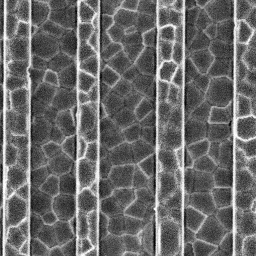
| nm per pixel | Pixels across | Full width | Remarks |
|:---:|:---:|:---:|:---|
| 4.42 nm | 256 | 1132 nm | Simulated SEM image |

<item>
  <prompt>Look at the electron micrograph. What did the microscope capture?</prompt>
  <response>one or a few lines or trenches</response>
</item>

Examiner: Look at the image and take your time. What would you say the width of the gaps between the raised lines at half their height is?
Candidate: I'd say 0.219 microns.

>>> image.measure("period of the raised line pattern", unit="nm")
339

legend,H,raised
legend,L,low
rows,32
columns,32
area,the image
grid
LHHHLLLLLLHHLLLLLLLLHHHLLLLLLHHH
LHHHLLLLLLHHLLLLLLLLHHHLLLLLLHHH
LHHHLLLLLLHHLLLLLLLLHHHLLLLLLHHH
LHHHLLLLLLHHLLLLLLLLHHHLLLLLLHHH
LHHHLLLLLLHHLLLLLLLLHHHLLLLLLHHH
LHHHLLLLLLHHLLLLLLLLHHHLLLLLLHHH
LHHHLLLLLLHHLLLLLLLLHHHLLLLLLHHH
LHHHLLLLLLHHLLLLLLLLHHHLLLLLLHHH
LHHHLLLLLLHHLLLLLLLLHHHLLLLLLHHH
LHHHLLLLLLHHLLLLLLLLHHHLLLLLLHHH
LHHHLLLLLLHHLLLLLLLLHHHLLLLLLHHH
LHHHLLLLLLHHLLLLLLLLHHHLLLLLLHHH
LHHHLLLLLLHHLLLLLLLLHHHLLLLLLHHH
LHHHLLLLLLHHLLLLLLLLHHHLLLLLLHHH
LHHHLLLLLLHHLLLLLLLLHHHLLLLLLHHH
LHHHLLLLLLHHLLLLLLLLHHHLLLLLLHHH
LHHHLLLLLLHHLLLLLLLLHHHLLLLLLHHH
LHHHLLLLLLHHLLLLLLLLHHHLLLLLLHHH
LHHHLLLLLLHHLLLLLLLLHHHLLLLLLHHH
LHHHLLLLLLHHLLLLLLLLHHHLLLLLLHHH
LHHHLLLLLLHHLLLLLLLLHHHLLLLLLHHH
LHHHLLLLLLHHLLLLLLLLHHHLLLLLLHHH
LHHHLLLLLLHHLLLLLLLLHHHLLLLLLHHH
LHHHLLLLLLHHLLLLLLLLHHHLLLLLLHHH
LHHHLLLLLLHHLLLLLLLLHHHLLLLLLHHH
HHHHLLLLLLHHLLLLLLLLHHHLLLLLLHHH
HHHHLLLLLLHHLLLLLLLHHHHLLLLLLHHH
HHHHLLLLLLHHLLLLLLLLHHHLLLLLLHHH
HHHHLLLLLLHHLLLLLLLLHHHLLLLLLHHH
HHHHLLLLLLHHLLLLLLLLHHHLLLLLLHHH
HHHHLLLLLLHHLLLLLLLLHHHLLLLLLHHH
HHHHLLLLLLHHLLLLLLLLHHHLLLLLLHHH